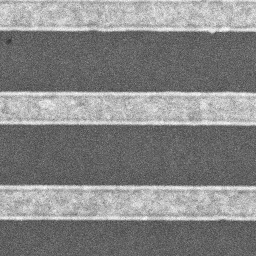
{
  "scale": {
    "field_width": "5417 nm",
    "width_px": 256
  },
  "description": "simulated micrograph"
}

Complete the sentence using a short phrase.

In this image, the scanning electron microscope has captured one or a few lines or trenches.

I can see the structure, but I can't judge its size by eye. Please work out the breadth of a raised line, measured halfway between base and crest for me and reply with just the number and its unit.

632 nanometers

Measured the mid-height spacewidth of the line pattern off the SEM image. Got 1.36 um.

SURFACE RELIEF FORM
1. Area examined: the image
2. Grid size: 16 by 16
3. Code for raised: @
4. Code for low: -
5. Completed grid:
@@@@@@@@@@@@@@@@
@@@@@@@@@@@@@@@@
----------------
----------------
----------------
----------------
@@@@@@@@@@@@@@@@
@@@@@@@@@@@@@@@@
----------------
----------------
----------------
----------------
@@@@@@@@@@@@@@@@
@@@@@@@@@@@@@@@@
----------------
----------------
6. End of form